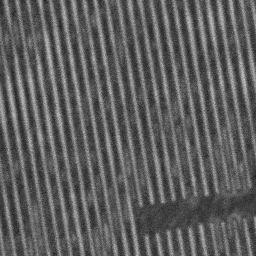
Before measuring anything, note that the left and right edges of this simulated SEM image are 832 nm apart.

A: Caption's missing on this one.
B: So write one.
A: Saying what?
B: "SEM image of parallel lines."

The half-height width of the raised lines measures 1.85 px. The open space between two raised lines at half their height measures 27.6 nanometers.